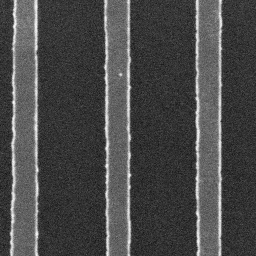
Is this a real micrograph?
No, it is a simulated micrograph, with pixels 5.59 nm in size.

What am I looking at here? lines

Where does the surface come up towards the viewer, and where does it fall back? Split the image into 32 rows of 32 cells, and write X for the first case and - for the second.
--XXX--------XXX---------XXX----
--XXX--------XXX---------XXX----
--XXX--------XXX---------XXX----
--XXX--------XXX---------XXX----
--XXX--------XXX---------XXX----
--XXX--------XXX---------XXX----
--XXX--------XXX---------XXX----
--XXX--------XXX---------XXX----
--XXX--------XXX---------XXX----
--XXX--------XXX---------XXX----
--XXX--------XXX---------XXX----
--XXX--------XXX---------XXX----
--XXX--------XXX---------XXX----
--XXX--------XXX---------XXX----
--XXX--------XXX---------XXX----
--XXX--------XXX---------XXX----
--XXX--------XXX---------XXX----
--XXX--------XXX---------XXX----
--XXX--------XXX---------XXX----
--XXX--------XXX---------XXX----
--XXX--------XXX---------XXX----
--XXX--------XXX---------XXX----
--XXX--------XXX---------XXX----
--XXX--------XXX---------XXX----
--XXX--------XXX---------XXX----
-XXXX--------XXX---------XXX----
-XXXX--------XXX---------XXX----
-XXXX--------XXX---------XXX----
-XXXX--------XXX---------XXX----
-XXXX--------XXX---------XXX----
-XXXX--------XXX---------XXX----
-XXXX--------XXX---------XXX----